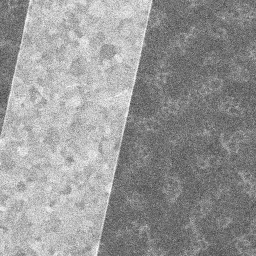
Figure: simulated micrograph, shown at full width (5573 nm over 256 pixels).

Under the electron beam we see one or a few lines or trenches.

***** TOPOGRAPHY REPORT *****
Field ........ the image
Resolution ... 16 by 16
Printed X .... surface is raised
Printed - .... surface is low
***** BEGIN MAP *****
--XXXXXXX-------
--XXXXXXX-------
-XXXXXXXX-------
-XXXXXXXX-------
-XXXXXXXX-------
-XXXXXXX--------
XXXXXXXX--------
XXXXXXXX--------
XXXXXXXX--------
XXXXXXX---------
XXXXXXX---------
XXXXXXX---------
XXXXXXX---------
XXXXXXX---------
XXXXXX----------
XXXXXX----------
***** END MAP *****